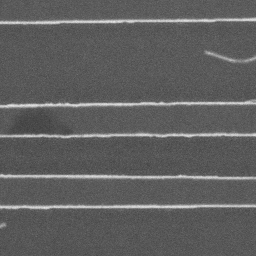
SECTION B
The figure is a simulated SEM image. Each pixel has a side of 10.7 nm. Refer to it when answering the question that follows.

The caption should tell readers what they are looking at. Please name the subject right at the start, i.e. lines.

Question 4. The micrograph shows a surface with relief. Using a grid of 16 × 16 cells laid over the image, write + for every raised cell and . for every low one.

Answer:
++++++++++++++++
................
................
................
................
................
......++++++++++
++++++++++++++++
+++++++.........
................
................
++++++++++++++++
++++++++++++++++
................
................
................